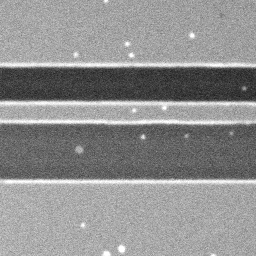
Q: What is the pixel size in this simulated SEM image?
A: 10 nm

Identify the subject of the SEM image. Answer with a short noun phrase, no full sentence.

lines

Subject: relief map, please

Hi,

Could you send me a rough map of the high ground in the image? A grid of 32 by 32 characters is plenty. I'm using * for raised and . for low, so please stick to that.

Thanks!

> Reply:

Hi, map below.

********************************
********************************
********************************
********************************
********************************
********************************
********************************
********************************
................................
................................
................................
................................
................................
********************************
********************************
................................
................................
................................
................................
................................
................................
................................
................................
********************************
********************************
********************************
********************************
********************************
********************************
********************************
********************************
********************************